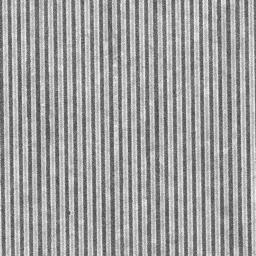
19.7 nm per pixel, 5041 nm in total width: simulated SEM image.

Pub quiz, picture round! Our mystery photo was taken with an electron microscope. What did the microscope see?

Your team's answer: parallel lines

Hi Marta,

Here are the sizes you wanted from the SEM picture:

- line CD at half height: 73.8 nanometers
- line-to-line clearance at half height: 0.0911 micrometres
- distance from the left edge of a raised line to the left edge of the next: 9.11 pixels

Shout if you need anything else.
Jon